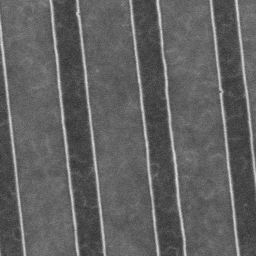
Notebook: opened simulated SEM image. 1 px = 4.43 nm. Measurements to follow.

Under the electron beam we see one or a few lines or trenches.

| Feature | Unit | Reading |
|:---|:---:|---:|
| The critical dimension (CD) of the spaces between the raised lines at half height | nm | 232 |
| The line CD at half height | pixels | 27.1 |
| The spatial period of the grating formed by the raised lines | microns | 0.352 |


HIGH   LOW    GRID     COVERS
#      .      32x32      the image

......####......####......####..
......####......####......####..
.......###......####.......###..
.......###.......###.......###..
.......###.......###.......###..
.......###.......###.......###..
.......###.......###.......###..
#......####......####......###..
#......####......####......####.
#......####......####......####.
#......####......####......####.
#......####.......###.......###.
#.......###.......###.......###.
#.......###.......###.......###.
#.......###.......###.......###.
#.......###.......###.......###.
#.......###.......###.......###.
##......####......####......###.
##......####......####......####
##......####......####......####
##......####.......###.......###
##.......###.......###.......###
##.......###.......###.......###
##.......###.......###.......###
##.......###.......###.......###
##.......###.......###.......###
###......####......####......###
###......####......####......###
###......####......####......###
###......####.......###.......##
###.......###.......###.......##
###.......###.......###.......##